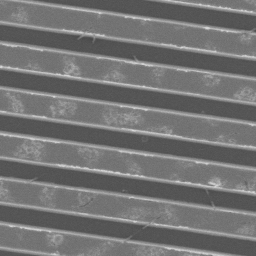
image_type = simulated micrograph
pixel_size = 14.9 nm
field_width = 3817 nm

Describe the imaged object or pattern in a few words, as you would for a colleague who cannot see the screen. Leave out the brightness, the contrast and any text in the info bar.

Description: parallel lines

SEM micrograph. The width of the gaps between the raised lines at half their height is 277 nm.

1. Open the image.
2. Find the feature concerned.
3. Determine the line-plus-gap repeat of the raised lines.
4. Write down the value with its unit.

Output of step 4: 666 nm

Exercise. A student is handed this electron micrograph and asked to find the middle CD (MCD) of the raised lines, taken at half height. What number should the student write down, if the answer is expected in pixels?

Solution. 25.6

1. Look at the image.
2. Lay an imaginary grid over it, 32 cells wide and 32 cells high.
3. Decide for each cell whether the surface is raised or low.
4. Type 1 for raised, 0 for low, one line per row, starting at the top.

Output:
11111100000000000000000111111111
11111111111111000000000000000011
11111111111111111111100000000000
00001111111111111111111111100000
00000000001111111111111111111111
11000000000000000011111111111111
11111111100000000000000001111111
11111111111111110000000000000000
11111111111111111111111000000000
00000001111111111111111111111100
00000000000001111111111111111111
11110000000000000000011111111111
11111111111000000000000000001111
11111111111111111110000000000000
00111111111111111111111110000000
00000000011111111111111111111111
00000000000000001111111111111111
11111110000000000000000011111111
11111111111111000000000000000001
11111111111111111111100000000000
00000111111111111111111111110000
00000000000011111111111111111111
11000000000000000001111111111111
11111111100000000000000001111111
11111111111111110000000000000000
01111111111111111111111000000000
00000000111111111111111111111100
00000000000000011111111111111111
11110000000000000000001111111111
11111111111100000000000000000111
11111111111111111110000000000000
00011111111111111111111111000000